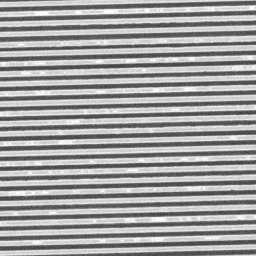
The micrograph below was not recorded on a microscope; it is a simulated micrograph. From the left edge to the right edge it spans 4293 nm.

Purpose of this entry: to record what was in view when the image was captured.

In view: parallel lines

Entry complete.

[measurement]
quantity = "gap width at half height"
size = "96.4 nm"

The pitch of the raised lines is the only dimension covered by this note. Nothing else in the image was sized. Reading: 167 nanometers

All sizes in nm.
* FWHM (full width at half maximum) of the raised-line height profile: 79.6